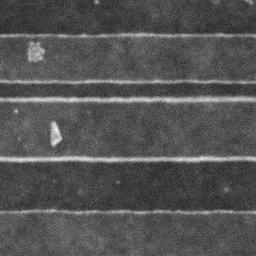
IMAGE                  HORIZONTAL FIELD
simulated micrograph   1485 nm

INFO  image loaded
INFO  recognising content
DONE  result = lines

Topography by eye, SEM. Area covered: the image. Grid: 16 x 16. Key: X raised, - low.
----------------
----------------
XXXXXXXXXXXXXXXX
XXXXXXXXXXXXXXXX
XXXXXXXXXXXXXXXX
XXXXXXXXXXXXXXXX
XXXXXXXXXXXXXXXX
XXXXXXXXXXXXXXXX
XXXXXXXXXXXXXXXX
XXXXXXXXXXXXXXXX
----------------
----------------
----------------
XXXXXXXXXXXXXXXX
XXXXXXXXXXXXXXXX
XXXXXXXXXXXXXXXX